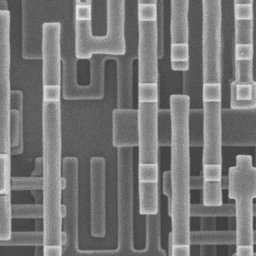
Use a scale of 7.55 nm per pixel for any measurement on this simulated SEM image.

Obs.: wiring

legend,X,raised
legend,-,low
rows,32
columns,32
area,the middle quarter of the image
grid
-------------------XXXX----XXXX-
-------------------XXXX----XXXX-
-------------------XXXX---------
-------------------XXXX---------
-------------------XXXX---------
-------------------XXXX---------
-------------------XXXX---------
-------------------XXXX---------
-------------------XXXX----XXXX-
-------------------XXXX----XXXX-
-------------------XXXX----XXXX-
-------------------XXXX----XXXX-
-------------------XXXX----XXXX-
-------------------XXXX----XXXX-
-------------------XXXX----XXXX-
-------------------XXXX----XXXX-
-------------------XXXX----XXXX-
-------------------XXXX----XXXX-
-------------------XXXX----XXXX-
-------------------XXXX----XXXX-
-------------------XXXX----XXXX-
-------------------XXXX----XXXX-
-------------------XXXX----XXXX-
-------------------XXXX----XXXX-
-------------------XXXX----XXXX-
-------------------XXXX----XXXX-
-------------------XXXX----XXXX-
-------------------XXXX----XXXX-
-------------------XXXX----XXXX-
-------------------XXXX----XXXX-
-------------------XXXX----XXXX-
-------------------XXXX----XXXX-